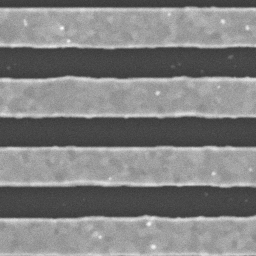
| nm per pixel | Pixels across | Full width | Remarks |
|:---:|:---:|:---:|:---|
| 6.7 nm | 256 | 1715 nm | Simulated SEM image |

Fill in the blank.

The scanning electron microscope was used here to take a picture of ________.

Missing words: lines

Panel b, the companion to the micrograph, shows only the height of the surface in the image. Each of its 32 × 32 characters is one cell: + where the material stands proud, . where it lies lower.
................................
++++++++++++++++++++++++++++++++
++++++++++++++++++++++++++++++++
++++++++++++++++++++++++++++++++
++++++++++++++++++++++++++++++++
++++++++++++++++++++++++++++++++
................................
................................
................................
................................
++++++++++++++++++++++++++++++++
++++++++++++++++++++++++++++++++
++++++++++++++++++++++++++++++++
++++++++++++++++++++++++++++++++
....+.....++...+...++....+++++.+
................................
................................
................................
...++++++++++...+.+++++++++++++.
++++++++++++++++++++++++++++++++
++++++++++++++++++++++++++++++++
++++++++++++++++++++++++++++++++
++++++++++++++++++++++++++++++++
................................
................................
................................
................................
++++++++++++++++++++++++++++++++
++++++++++++++++++++++++++++++++
++++++++++++++++++++++++++++++++
++++++++++++++++++++++++++++++++
++++++++++++++++++++++++++++++++